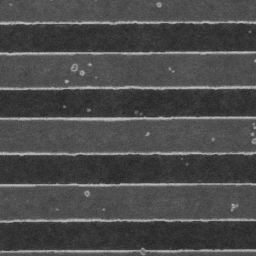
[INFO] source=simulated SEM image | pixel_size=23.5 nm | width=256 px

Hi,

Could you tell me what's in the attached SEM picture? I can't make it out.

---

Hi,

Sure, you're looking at lines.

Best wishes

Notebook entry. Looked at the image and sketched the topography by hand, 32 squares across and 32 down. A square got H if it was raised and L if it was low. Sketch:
HHHHHHHHHHHHHHHHHHHHHHHHHHHHHHHH
HHHHHHHHHHHHHHHHHHHHHHHHHHHHHHHH
HHHHHHHHHHHHHHHHHHHHHHHHHHHHHHHH
LLLLLLLLLLLLLLLLLLLLLLLLLLLLLLLL
LLLLLLLLLLLLLLLLLLLLLLLLLLLLLLLL
LLLLLLLLLLLLLLLLLLLLLLLLLLLLLLLL
LLLLLLLLLLLLLLLLLLLLLLLLLLLLLLLL
HHHHHHHHHHHHHHHHHHHHHHHHHHHHHHHH
HHHHHHHHHHHHHHHHHHHHHHHHHHHHHHHH
HHHHHHHHHHHHHHHHHHHHHHHHHHHHHHHH
HHHHHHHHHHHHHHHHHHHHHHHHHHHHHHHH
LLLLLLLLLLLLLLLLLLLLLLLLLLLLLLLL
LLLLLLLLLLLLLLLLLLLLLLLLLLLLLLLL
LLLLLLLLLLLLLLLLLLLLLLLLLLLLLLLL
LLLLLLLLLLLLLLLLLLLLLLLLLLLLLLLL
HHHHHHHHHHHHHHHHHHHHHHHHHHHHHHHH
HHHHHHHHHHHHHHHHHHHHHHHHHHHHHHHH
HHHHHHHHHHHHHHHHHHHHHHHHHHHHHHHH
HHHHHHHHHHHHHHHHHHHHHHHHHHHHHHHH
LLLLLLLLLLLLLLLLLLLLLLLLLLLLLLLL
LLLLLLLLLLLLLLLLLLLLLLLLLLLLLLLL
LLLLLLLLLLLLLLLLLLLLLLLLLLLLLLLL
LLLLLLLLLLLLLLLLLLLLLLLLLLLLLLLL
HHHHHHHHHHHHHHHHHHHHHHHHHHHHHHHH
HHHHHHHHHHHHHHHHHHHHHHHHHHHHHHHH
HHHHHHHHHHHHHHHHHHHHHHHHHHHHHHHH
HHHHHHHHHHHHHHHHHHHHHHHHHHHHHHHH
HHHHHHHHHHHHHHHHHHHHHHHHHHHHHLHH
LLLLLLLLLLLLLLLLLLLLLLLLLLLLLLLL
LLLLLLLLLLLLLLLLLLLLLLLLLLLLLLLL
LLLLLLLLLLLLLLLLLLLLLLLLLLLLLLLL
HHHHHHHHHHHHHHHHHHHHHHHHHHHHHHHH